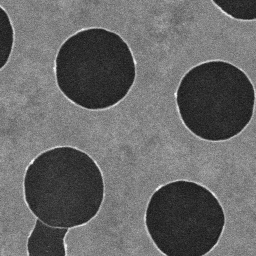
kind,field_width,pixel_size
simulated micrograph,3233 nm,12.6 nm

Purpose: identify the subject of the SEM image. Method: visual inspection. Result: holes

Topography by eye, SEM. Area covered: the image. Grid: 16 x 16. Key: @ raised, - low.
@@@@@@@@@@@@@@--
-@@@@@@@@@@@@@@@
-@@@----@@@@@@@@
-@@@----@@@@@@@@
@@@@----@@@@---@
@@@@----@@@-----
@@@@@--@@@@-----
@@@@@@@@@@@-----
@@@@@@@@@@@@---@
@@@--@@@@@@@@@@@
@@----@@@@@@@@@@
@@----@@@@@-@@@@
@@----@@@-----@@
@@----@@@-----@@
@@--@@@@@-----@@
@@--@@@@@@---@@@